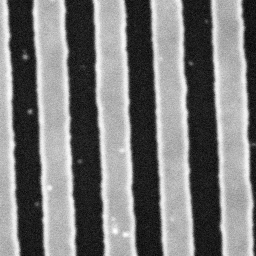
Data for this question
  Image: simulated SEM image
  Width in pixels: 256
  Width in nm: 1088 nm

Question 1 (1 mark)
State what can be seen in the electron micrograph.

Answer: lines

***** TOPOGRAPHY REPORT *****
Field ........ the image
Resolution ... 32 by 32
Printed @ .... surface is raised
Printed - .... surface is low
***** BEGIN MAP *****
@---@@@@----@@@@---@@@@---@@@@--
@---@@@@----@@@@---@@@@----@@@--
@---@@@@----@@@@---@@@@----@@@--
@---@@@@----@@@@---@@@@----@@@--
@---@@@@----@@@@---@@@@----@@@--
@---@@@@----@@@@---@@@@----@@@--
@----@@@----@@@@---@@@@----@@@--
@----@@@----@@@@---@@@@----@@@@-
@----@@@----@@@@---@@@@----@@@@-
@----@@@@---@@@@---@@@@----@@@@-
@----@@@@---@@@@---@@@@----@@@@-
@----@@@@---@@@@---@@@@----@@@@-
@----@@@@---@@@@----@@@----@@@@-
@----@@@@---@@@@----@@@----@@@@-
@----@@@@---@@@@----@@@----@@@@-
@----@@@@---@@@@----@@@----@@@@-
@@---@@@@---@@@@----@@@----@@@@-
@@---@@@@----@@@----@@@@---@@@@-
@@---@@@@----@@@----@@@@---@@@@-
@@---@@@@----@@@----@@@----@@@@-
@@---@@@@----@@@----@@@@---@@@@-
@@---@@@@----@@@----@@@@---@@@@-
@@---@@@@----@@@----@@@@---@@@@-
@@---@@@@----@@@----@@@@---@@@@-
@@---@@@@----@@@@---@@@@----@@@-
@@---@@@@----@@@@---@@@@----@@@@
@@----@@@----@@@@---@@@@----@@@-
@@----@@@----@@@@---@@@@----@@@-
@@----@@@----@@@@---@@@@----@@@-
@@----@@@----@@@@---@@@@----@@@@
@@----@@@----@@@@---@@@@----@@@@
@@----@@@----@@@@---@@@@----@@@@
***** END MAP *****